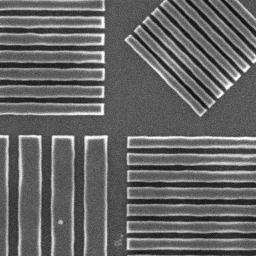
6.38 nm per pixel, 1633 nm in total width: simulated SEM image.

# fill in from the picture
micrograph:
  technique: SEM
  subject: groups of lines, slits or small figures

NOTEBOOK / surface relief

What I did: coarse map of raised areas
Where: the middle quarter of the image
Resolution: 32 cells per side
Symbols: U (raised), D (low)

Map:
DDDDDDDDDDDDDDDDDDDDDDUUDDUUUDDU
UUUUUUUUUUDDDDDDDDDDDDDUUDDUUUDD
UUUUUUUUUUDDDDDDDDDDDDDDUUDDUUUD
UUUUUUUUUUDDDDDDDDDDDDDDDUUUDUUU
DDDDDDDDDDDDDDDDDDDDDDDDDDUUUDUU
UUUUDDDDDDDDDDDDDDDDDDDDDDDUUUDU
UUUUUUUUUUDDDDDDDDDDDDDDDDDDUUDD
UUUUUUUUUUDDDDDDDDDDDDDDDDDDDUUU
DDDDDDDDDDDDDDDDDDDDDDDDDDDDDDUU
DDDDDDDDDDDDDDDDDDDDDDDDDDDDDDDU
UUUUUUUUUUDDDDDDDDDDDDDDDDDDDDDD
UUUUUUUUUUDDDDDDDDDDDDDDDDDDDDDD
UUDDDDDDDDDDDDDDDDDDDDDDDDDDDDDD
DDDDDDDDDDDDDDDDDDDDDDDDDDDDDDDD
DDDDDDDDDDDDDDDDDDDDDDDDDDDDDDDD
DDDDDDDDDDDDDDDDDDDDDDDDDDDDDDDD
DDDDDDDDDDDDDDDDDDDDDDDDDDDDDDDD
DDDDDDDDDDDDDDDDDDDDDDDDDDDDDDDD
UUDDDDUUUUDDDDDDUUUUUUUUUUUUUUUU
UUDDDUUUUUDDDDDDUUUUUUUUUUUUUUUU
UUDDDUUUUUDDDDDDUUUUUUUUUUUUUUUU
UUDDDUUUUUDDDDDDDDDDDDDDDDDDDDDD
UUUDDUUUUUUDDDDDUUDDDDDDDDDDDUDD
UUUDDUUUUUUDDDDDUUUUUUUUUUUUUUUU
UUDDDUUUUUUDDDDDUUUUUUUUUUUUUUUU
UUDDDUUUUUUDDDDDDDDDDDDDDDDDDDDD
UUUDDUUUUUUDDDDDDDDDDDDDDDDDDDDD
UUDDDUUUUUUDDDDDUUUUUUUUUUUUUUUU
UUDDDUUUUUDDDDDDUUUUUUUUUUUUUUUU
UUDDDUUUUUUDDDDDDDDDDDDDDDDDDDDD
UUUDDUUUUUDDDDDDDDDDDDDDDDDDDDDD
UUUDDUUUUUDDDDDDUUUUUUUUUUUUUUUU